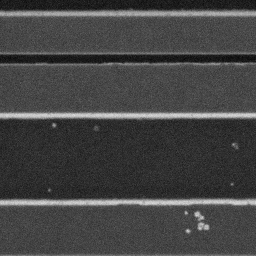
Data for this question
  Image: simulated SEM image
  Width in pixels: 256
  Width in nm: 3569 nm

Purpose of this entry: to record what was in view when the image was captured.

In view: lines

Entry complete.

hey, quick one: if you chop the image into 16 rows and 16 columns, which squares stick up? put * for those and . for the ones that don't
................
****************
****************
****************
****************
****************
****************
................
................
................
................
................
................
****************
****************
****************